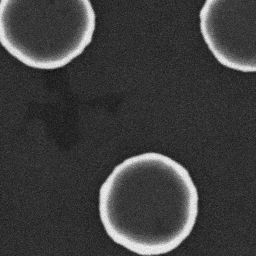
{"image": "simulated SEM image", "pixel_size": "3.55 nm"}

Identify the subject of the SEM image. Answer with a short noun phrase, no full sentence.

raised bodies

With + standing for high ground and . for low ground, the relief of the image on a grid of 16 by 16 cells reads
++++++.......+++
++++++.......+++
+++++........+++
.++++.........++
................
................
................
................
................
................
.......++++.....
.......+++++....
......++++++....
......++++++....
.......+++++....
.........+......